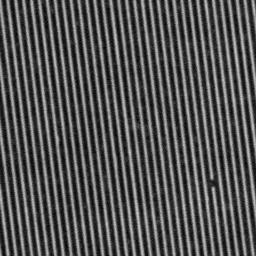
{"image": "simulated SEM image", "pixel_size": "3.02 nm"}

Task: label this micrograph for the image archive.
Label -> parallel lines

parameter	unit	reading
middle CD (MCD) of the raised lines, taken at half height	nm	6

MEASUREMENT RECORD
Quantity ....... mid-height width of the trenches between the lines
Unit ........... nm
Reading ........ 17.6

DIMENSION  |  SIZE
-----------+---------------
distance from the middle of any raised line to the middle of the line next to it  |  23.7 nm